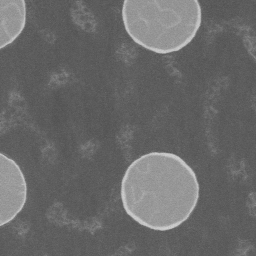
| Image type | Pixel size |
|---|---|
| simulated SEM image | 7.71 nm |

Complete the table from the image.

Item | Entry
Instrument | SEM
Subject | raised bodies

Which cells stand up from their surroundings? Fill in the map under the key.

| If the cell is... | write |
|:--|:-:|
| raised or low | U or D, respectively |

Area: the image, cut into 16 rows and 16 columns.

UUDDDDDDUUUUDDDD
UUDDDDDDUUUUDDDD
UDDDDDDDUUUUDDDD
DDDDDDDDDDDDDDDD
DDDDDDDDDDDDDDDD
DDDDDDDDDDDDDDDD
DDDDDDDDDDDDDDDD
DDDDDDDDDDDDDDDD
DDDDDDDDDDDDDDDD
DDDDDDDDDDDDDDDD
DDDDDDDDUUUUDDDD
DDDDDDDDUUUUDDDD
DDDDDDDDUUUUDDDD
DDDDDDDDUUUUDDDD
DDDDDDDDDDDDDDDD
DDDDDDDDDDDDDDDD